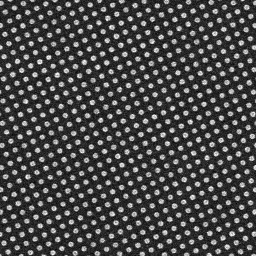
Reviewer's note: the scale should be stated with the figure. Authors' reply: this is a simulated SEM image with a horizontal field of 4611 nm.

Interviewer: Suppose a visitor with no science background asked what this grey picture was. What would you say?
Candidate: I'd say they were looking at a regular array of raised bodies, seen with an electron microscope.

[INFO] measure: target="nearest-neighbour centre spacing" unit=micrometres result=0.174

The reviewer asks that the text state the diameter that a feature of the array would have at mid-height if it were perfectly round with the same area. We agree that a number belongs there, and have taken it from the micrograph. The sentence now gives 86.2 nanometres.